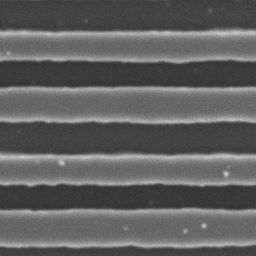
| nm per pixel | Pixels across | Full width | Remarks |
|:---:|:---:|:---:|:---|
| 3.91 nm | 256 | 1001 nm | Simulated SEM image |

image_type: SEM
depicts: lines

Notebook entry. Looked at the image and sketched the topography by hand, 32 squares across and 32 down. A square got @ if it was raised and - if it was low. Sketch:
--------------------------------
--------------------------------
--------------------------------
--------------------------------
@@@@@@@@@@@@@@@@@@@@@@@@@@@@@@@@
@@@@@@@@@@@@@@@@@@@@@@@@@@@@@@@@
@@@@@@@@@@@@@@@@@@@@@@@@@@@@@@@@
@---@--@---@@@@@@@@@@@@@@@----@@
--------------------------------
--------------------------------
--------------------------------
@@@@@@@@@@@@@@@@@@@@@@@@@@@@@@@@
@@@@@@@@@@@@@@@@@@@@@@@@@@@@@@@@
@@@@@@@@@@@@@@@@@@@@@@@@@@@@@@@@
@@@@@@@@@@@@@@@@@@@@@@@@@@@@@@@@
--------------------------------
--------------------------------
--------------------------------
--------------------------------
------@--------------------@@---
@@@@@@@@@@@@@@@@@@@@@@@@@@@@@@@@
@@@@@@@@@@@@@@@@@@@@@@@@@@@@@@@@
@@@@@@@@@@@@@@@@@@@@@@@@@@@@@@@@
--------------------------------
--------------------------------
--------------------------------
@@@@@@@@@@@@@@@@@@@@@@@@@@@@@@@@
@@@@@@@@@@@@@@@@@@@@@@@@@@@@@@@@
@@@@@@@@@@@@@@@@@@@@@@@@@@@@@@@@
@@@@@@@@@@@@@@@@@@@@@@@@@@@@@@@@
@@@@@@@@@@@@@@@@@@@@@@@@@@@@@@@@
--------------------------------